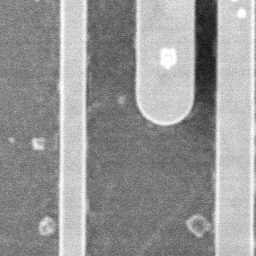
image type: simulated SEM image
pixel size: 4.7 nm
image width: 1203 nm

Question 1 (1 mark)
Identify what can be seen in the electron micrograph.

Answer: groups of lines, slits or small figures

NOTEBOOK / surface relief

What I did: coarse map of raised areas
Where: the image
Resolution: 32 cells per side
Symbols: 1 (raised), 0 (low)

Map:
00000000111000000111111100011111
00000000111000000111111100011111
00000000111000000111111100011111
00000000111000000111111100011111
00000000111000000111111100011111
00000000111000000111111100011111
00000000111000000111111100011111
00000000111000000111111100011111
00000000111000000111111100011111
00000000111000000111111100011111
00000000111000000111111100011111
00000000111000000111111100011111
00000000111000000111111100011111
00000000111000000111111100011111
00000000111000000011111000011111
00000000111000000000100000011111
00000000111000000000000000011111
00000000111000000000000000011111
00000000111000000000000000011111
00000000111000000000000000011111
00000000111000000000000000011111
00000000111000000000000000011111
00000000111000000000000000011111
00000000111000000000000000011111
00000000111000000000000000011111
00000000111000000000000000011111
00000000111000000000000000011110
00000000111000000000000000011110
00000000111000000000000000011110
00000000111000000000000000011110
00000000110000000000000000011110
00000000110000000000000000011110